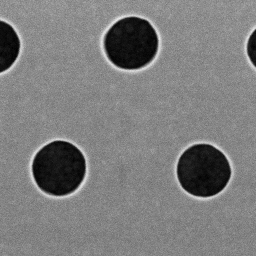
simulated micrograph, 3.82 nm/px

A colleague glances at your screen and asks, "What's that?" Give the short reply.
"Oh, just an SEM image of holes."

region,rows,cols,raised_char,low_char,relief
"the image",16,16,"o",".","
oooooooooooooooo
ooooooo..ooooooo
.oooooo...oooooo
.oooooo...oooooo
oooooooooooooooo
oooooooooooooooo
oooooooooooooooo
oooooooooooooooo
oooooooooooooooo
oo...ooooooo..oo
oo...oooooo...oo
oo...oooooo...oo
oooooooooooooooo
oooooooooooooooo
oooooooooooooooo
oooooooooooooooo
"